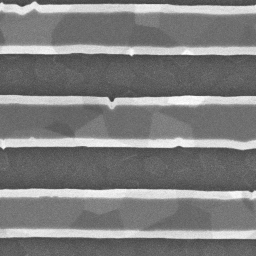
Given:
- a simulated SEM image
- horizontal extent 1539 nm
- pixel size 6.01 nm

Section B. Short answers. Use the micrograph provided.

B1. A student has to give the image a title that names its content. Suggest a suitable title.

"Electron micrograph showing one or a few lines or trenches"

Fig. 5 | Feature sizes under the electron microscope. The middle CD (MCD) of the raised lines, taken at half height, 254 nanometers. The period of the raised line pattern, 554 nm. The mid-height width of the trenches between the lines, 299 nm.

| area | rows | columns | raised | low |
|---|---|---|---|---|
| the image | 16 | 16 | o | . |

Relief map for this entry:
o.o...oooo......
oooooooooooooooo
oooooooooooooooo
................
................
................
oooooooooooooooo
oooooooooooooooo
oooooooooooooooo
................
................
................
oooooooooooooooo
oooooooooooooooo
oooooooooooooooo
................